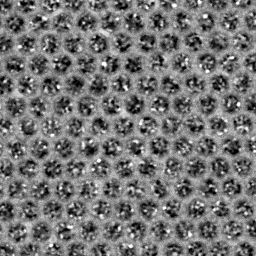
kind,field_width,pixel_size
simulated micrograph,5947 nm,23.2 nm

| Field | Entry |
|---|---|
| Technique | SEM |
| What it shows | a regular array of raised bodies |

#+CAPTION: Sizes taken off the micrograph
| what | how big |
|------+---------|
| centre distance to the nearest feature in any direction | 542 nanometers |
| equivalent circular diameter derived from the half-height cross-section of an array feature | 384 nm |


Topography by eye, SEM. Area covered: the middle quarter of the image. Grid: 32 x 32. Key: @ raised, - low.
@@--@@@@--@@@---@@@@--@@@---@@@-
@---@@@---@@@---@@@----@-----@@-
--------------------------------
--@@----@----@@@----@@----@@----
-@@@@--@@@---@@@@--@@@@--@@@@--@
-@@@@--@@@---@@@@--@@@@--@@@@--@
-@@@@--@@@---@@@---@@@---@@@---@
--------------------------------
-----------@@----@-----@-----@@-
@@--@@@@--@@@@--@@@@--@@@@--@@@@
@@--@@@@--@@@@--@@@@--@@@@--@@@-
@@--@@@@--@@@@--@@@---@@@@--@@@-
-----@---------@----------------
------------------------------@-
--@@---@@@@--@@@@--@@@@--@@@@-@@
-@@@@--@@@@--@@@@--@@@@--@@@@-@@
-@@@@--@@@@--@@@@--@@@@--@@@@--@
--@@----@------@----@-----@-----
--------------------------------
@----@@@---@@---@@@---@@@@--@@@@
@@--@@@@--@@@@--@@@@--@@@@--@@@@
@@--@@@@--@@@@--@@@@--@@@@--@@@@
@----@@----@@----@@----@@----@@-
--------------------------------
--@@----@@----@@----@@----@@---@
-@@@@--@@@@--@@@@--@@@@--@@@@--@
-@@@@--@@@@--@@@@--@@@@--@@@@--@
--@@----@@@---@@@--@@@----@@----
--------------------------------
-----------@@----------@@----@@-
@@--@@@@--@@@@--@@@@--@@@@--@@@@
@@--@@@@--@@@@--@@@@--@@@@--@@@@